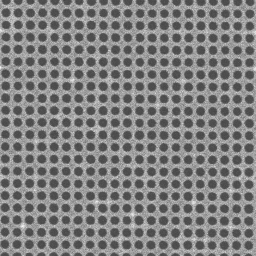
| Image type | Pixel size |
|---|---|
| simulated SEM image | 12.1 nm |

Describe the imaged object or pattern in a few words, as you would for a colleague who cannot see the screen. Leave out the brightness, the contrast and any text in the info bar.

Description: a regular array of holes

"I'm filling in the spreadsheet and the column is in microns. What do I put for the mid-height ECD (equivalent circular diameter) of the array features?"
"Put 0.109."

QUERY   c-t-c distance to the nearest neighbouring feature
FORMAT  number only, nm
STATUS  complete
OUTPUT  145